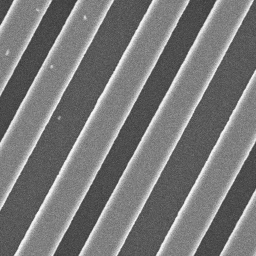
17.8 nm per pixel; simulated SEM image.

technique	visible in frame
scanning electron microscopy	lines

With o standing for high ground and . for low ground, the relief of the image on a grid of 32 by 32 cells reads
..oooo...ooooo.....oooo....oooo.
.ooooo...oooo.....ooooo...ooooo.
ooooo...ooooo.....oooo....oooo..
ooooo...oooo.....ooooo...ooooo..
oooo...ooooo.....oooo....oooo...
oooo...oooo.....ooooo...ooooo...
ooo...ooooo.....oooo....oooo....
oo....oooo.....ooooo...ooooo....
oo...ooooo.....oooo....oooo.....
o....oooo.....ooooo...ooooo.....
o...ooooo....ooooo...ooooo.....o
...ooooo.....ooooo...ooooo....oo
...oooo.....ooooo...ooooo.....oo
..ooooo.....oooo....oooo.....ooo
..oooo.....ooooo...ooooo.....ooo
.ooooo.....oooo....oooo.....oooo
.oooo.....ooooo...ooooo.....oooo
ooooo.....oooo....oooo.....ooooo
oooo.....ooooo...ooooo.....ooooo
oooo.....oooo....oooo.....ooooo.
ooo.....ooooo...ooooo.....oooo..
ooo....ooooo....oooo.....ooooo..
oo.....ooooo...ooooo.....oooo...
oo....ooooo...ooooo.....ooooo...
o.....ooooo...ooooo....ooooo....
.....ooooo...ooooo.....ooooo...o
.....ooooo...ooooo....ooooo...oo
....ooooo...ooooo.....ooooo...oo
....oooo....oooo.....ooooo...ooo
...ooooo...ooooo.....oooo....ooo
...oooo....oooo.....ooooo...oooo
..ooooo...ooooo.....oooo....oooo